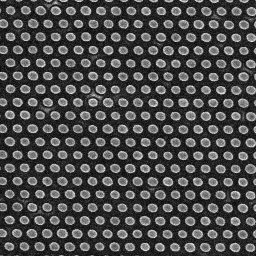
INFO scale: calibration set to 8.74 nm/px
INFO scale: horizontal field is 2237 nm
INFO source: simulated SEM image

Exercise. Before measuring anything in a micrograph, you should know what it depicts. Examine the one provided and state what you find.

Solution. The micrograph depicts a regular array of raised bodies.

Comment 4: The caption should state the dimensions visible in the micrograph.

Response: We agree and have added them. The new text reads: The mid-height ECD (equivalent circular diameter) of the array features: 77.7 nm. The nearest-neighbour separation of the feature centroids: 128 nm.